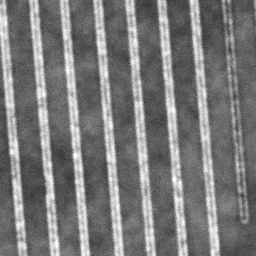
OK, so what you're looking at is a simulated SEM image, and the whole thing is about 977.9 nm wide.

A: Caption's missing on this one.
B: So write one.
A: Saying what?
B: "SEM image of parallel lines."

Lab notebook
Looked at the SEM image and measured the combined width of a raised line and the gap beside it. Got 122 nm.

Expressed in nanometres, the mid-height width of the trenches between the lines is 98.6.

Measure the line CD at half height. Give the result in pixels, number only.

6.23